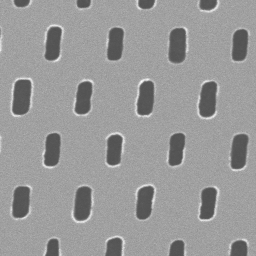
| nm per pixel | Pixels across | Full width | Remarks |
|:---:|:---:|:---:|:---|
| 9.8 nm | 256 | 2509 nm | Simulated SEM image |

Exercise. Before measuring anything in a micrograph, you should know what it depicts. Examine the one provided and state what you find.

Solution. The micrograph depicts a regular array of holes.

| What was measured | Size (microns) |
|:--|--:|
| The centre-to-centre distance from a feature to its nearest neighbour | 0.594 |